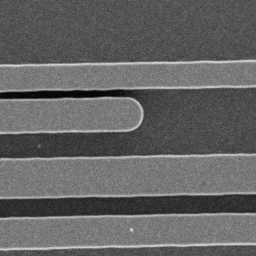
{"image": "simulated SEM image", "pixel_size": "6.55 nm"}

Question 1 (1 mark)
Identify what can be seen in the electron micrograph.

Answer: groups of lines, slits or small figures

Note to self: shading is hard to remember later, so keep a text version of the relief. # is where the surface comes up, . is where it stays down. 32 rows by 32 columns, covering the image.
................................
................................
................................
................................
................................
................................
................................
................................
################################
################################
################################
................................
#################...............
##################..............
##################..............
#################...............
########........................
................................
................................
................################
################################
################################
################################
################################
#################...............
................................
................................
################################
################################
################################
################################
................................